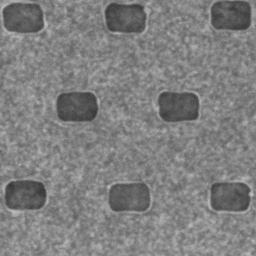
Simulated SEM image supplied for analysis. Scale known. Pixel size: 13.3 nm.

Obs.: holes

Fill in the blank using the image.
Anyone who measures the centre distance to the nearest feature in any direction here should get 1340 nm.